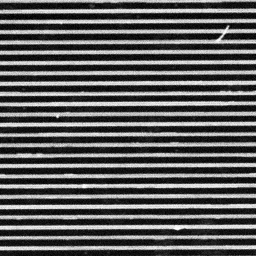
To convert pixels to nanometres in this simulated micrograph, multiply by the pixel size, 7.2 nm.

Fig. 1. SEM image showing parallel lines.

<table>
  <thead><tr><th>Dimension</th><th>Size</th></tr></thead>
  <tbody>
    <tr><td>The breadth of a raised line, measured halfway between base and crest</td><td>20.7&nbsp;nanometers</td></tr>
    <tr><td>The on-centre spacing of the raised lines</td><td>74.1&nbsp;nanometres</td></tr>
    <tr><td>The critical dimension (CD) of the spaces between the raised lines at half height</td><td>55.8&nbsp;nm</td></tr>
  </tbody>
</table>